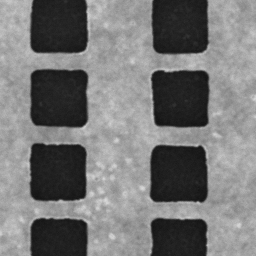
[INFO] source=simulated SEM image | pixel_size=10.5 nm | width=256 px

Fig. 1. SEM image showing holes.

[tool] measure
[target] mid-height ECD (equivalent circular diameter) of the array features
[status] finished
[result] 663 nm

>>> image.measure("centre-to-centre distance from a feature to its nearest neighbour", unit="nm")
787